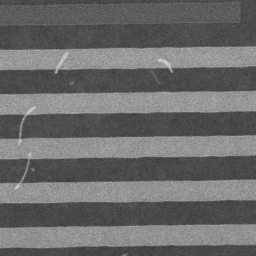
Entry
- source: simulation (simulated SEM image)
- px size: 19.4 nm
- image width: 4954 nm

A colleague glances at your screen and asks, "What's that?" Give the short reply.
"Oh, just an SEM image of groups of lines, slits or small figures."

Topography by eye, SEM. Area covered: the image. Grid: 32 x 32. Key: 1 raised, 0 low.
00000000000000000000111111111100
11111111111111111111111111111100
11111111111111111111111111111100
00000000000000000000000000000000
00000000000000000000000000000000
00000000000000000000000000000000
11111111111111111111111111111111
11111111111111111111111111111111
11111111111011011010010000000000
00000000000000000000000000000000
00000000000000000000000000000000
00000000000000000000000000000111
11111111111111111111111111111111
11111111111111111111111111111111
00000000000000000000000000000000
00000000000000000000000000000000
00000000000000000000000000000000
11111111111111111111111111111111
11111111111111111111111111111111
11111111111111111100110000000000
00000000000000000000000000000000
00000000000000000000000000000000
00000000000000000000000000000000
11111111111111111111111111111111
11111111111111111111111111111111
00000000000000000000000000000000
00000000000000000000000000000000
00000000000000000000000000000000
00001111111111111111111111111111
11111111111111111111111111111111
11111111111111111111111111110000
00000000000000000000000000000000